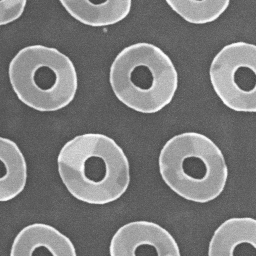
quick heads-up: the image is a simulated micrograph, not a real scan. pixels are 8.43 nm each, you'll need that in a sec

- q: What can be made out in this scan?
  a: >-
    ring-shaped raised bodies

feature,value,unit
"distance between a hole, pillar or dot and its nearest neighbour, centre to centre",845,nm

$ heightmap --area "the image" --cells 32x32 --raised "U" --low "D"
UUUDDDDDUUUUDUUUDDDDDUUUUUUUDDDD
UUUDDDDDDUUUUUUUDDDDDDUUUUUUDDDD
UUDDDDDDDDUUUUUDDDDDDDDUUUDDDDDD
DDDDDDDDDDDDDDDDDDDDDDDDDDDDDDDD
DDDDDDDDDDDDDDDDDDDDDDDDDDDDDDDD
DDDDDDDDDDDDDDDDDDDDDDDDDDDDDDDD
DDUUUUUDDDDDDDDUUUUUDDDDDDDDUUUU
DDUUUUUUUDDDDDUUUUUUUDDDDDDUUUUU
DUUUUDUUUDDDDDUUUDDUUUDDDDUUUUDU
DUUUDDDUUDDDDDUUDDDUUUDDDDUUUDDD
DDUUDDDUUDDDDDUUUDDUUUDDDDDUUDDD
DDUUUUUUUDDDDDUUUUUUUUDDDDDUUUDU
DDDUUUUUUDDDDDDUUUUUUDDDDDDDUUUU
DDDDUUUDDDDDDDDDDUUUDDDDDDDDDUUU
DDDDDDDDDDDDDDDDDDDDDDDDDDDDDDDD
DDDDDDDDDDDDDDDDDDDDDDDDDDDDDDDD
DDDDDDDDDDDDDDDDDDDDDDDDDDDDDDDD
UDDDDDDDDUUUUUDDDDDDDUUUUUDDDDDD
UUDDDDDDUUUUUUUDDDDDDUUUUUUDDDDD
UUUDDDDUUUUUUUUUDDDDUUUUUUUUDDDD
DUUDDDDUUUDDDUUUDDDDUUUDDDUUDDDD
DUUDDDDUUUDDDUUUDDDDUUUDDDUUDDDD
UUUDDDDDUUUDDUUUDDDDDUUUDUUUDDDD
UUUDDDDDUUUUUUUUDDDDDDUUUUUUDDDD
UUDDDDDDDUUUUUUDDDDDDDDUUUUDDDDD
DDDDDDDDDDDDDDDDDDDDDDDDDDDDDDDD
DDDDDDDDDDDDDDDDDDDDDDDDDDDDDDDD
DDDDDDDDDDDDDDDDDDDDDDDDDDDDDUUU
DDDUUUDDDDDDDDDUUUUUDDDDDDDUUUUU
DDUUUUUUDDDDDDUUUUUUUDDDDDDUUUUU
DDUUUUUUUDDDDDUUUUDUUUDDDDUUUUDU
DDUUDDUUUDDDDDUUUDDDUUDDDDUUUDDD